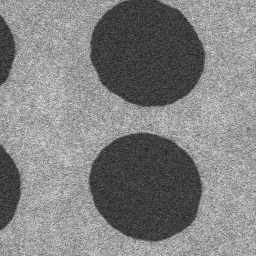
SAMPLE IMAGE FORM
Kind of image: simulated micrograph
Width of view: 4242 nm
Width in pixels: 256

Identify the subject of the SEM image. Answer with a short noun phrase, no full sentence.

holes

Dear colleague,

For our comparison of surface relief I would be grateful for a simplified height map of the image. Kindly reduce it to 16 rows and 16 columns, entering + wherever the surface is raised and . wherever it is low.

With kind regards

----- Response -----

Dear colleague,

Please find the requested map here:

+++++++....+++++
++++++......++++
.+++++.......+++
.+++++.......+++
.+++++.......+++
+++++++.....++++
++++++++...+++++
++++++++++++++++
++++++++..++++++
++++++......++++
.+++++......++++
.+++++.......+++
.+++++.......+++
.+++++......++++
+++++++....+++++
++++++++++++++++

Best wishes